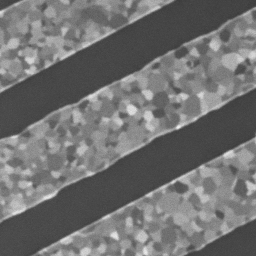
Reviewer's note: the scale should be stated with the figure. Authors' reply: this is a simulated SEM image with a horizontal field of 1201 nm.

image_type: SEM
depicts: one or a few lines or trenches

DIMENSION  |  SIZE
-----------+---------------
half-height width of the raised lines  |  326 nanometres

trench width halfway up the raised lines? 215 nanometers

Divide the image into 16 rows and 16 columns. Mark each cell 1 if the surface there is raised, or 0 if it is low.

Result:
0111111111000000
1111111100000011
1111110000001111
1111000000111111
1100000001111111
0000000111111111
0000011111111100
0001111111110000
0111111111000000
1111111100000011
1111111000001111
1111000000011111
1110000001111111
1000000111111111
0000011111111100
0001111111110000